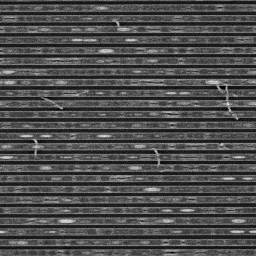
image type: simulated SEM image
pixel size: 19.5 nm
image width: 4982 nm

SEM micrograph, parallel lines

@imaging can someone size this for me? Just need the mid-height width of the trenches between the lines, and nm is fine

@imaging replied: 68.1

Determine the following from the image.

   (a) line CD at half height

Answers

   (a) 6.88 px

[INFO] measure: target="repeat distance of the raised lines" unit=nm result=208